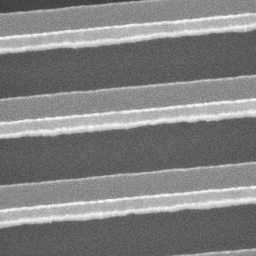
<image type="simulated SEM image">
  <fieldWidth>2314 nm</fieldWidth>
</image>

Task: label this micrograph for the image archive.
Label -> lines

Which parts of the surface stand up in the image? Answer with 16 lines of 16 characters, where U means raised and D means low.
DDDDUUUUUUUUUUUU
UUUUUUUUUUUUUUUU
UUUUUUUUDDDDDDDD
DDDDDDDDDDDDDDDD
DDDDDDDDDDDDDDDD
DDDDDDDUUUUUUUUU
UUUUUUUUUUUUUUUU
UUUUUUUUUUUUDDDD
UDDDDDDDDDDDDDDD
DDDDDDDDDDDDDDDD
DDDDDDDDDDDDUUUU
DDUUUUUUUUUUUUUU
UUUUUUUUUUUUUUUU
UUUUUUDDDDDDDDDD
DDDDDDDDDDDDDDDD
DDDDDDDDDDDDDDDD